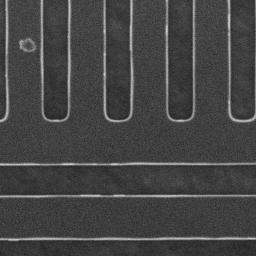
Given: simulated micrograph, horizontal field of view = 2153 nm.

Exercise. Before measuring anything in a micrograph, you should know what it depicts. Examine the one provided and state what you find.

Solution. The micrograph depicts groups of lines, slits or small figures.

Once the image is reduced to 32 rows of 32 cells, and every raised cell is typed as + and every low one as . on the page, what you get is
.++++....++++...+++++...+++++...
.++++....++++...+++++...+++++...
.++++....++++...+++++...+++++...
.++++....++++...+++++...+++++...
.++++....++++...+++++...+++++...
.++++....++++...+++++...+++++...
.++++....++++...+++++...+++++...
.++++....++++...+++++...+++++...
.++++....++++....++++...+++++...
.++++....++++....++++...+++++...
.++++....++++....++++...+++++...
.++++....++++....++++...+++++...
.++++....++++....++++...+++++...
.++++....++++...+++++...+++++...
.+++++..+++++...+++++...+++++...
++++++++++++++++++++++++++++++++
++++++++++++++++++++++++++++++++
++++++++++++++++++++++++++++++++
++++++++++++++++++++++++++++++++
++++++++++++++++++++++++++++++++
++++++++++++++++.......+++++++..
................................
................................
................................
................................
++++++++++++++++++++++++++++++++
++++++++++++++++++++++++++++++++
++++++++++++++++++++++++++++++++
++++++++++++++++++++++++++++++++
++++++++++++++++++++++++++++++++
................................
................................